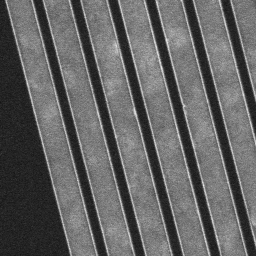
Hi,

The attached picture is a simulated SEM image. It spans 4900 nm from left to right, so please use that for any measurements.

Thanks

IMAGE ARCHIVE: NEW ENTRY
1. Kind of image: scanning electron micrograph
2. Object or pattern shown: parallel lines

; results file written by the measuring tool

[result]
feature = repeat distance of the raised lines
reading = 695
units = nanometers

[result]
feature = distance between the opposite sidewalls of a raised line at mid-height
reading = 234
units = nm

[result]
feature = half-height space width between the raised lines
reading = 466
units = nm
